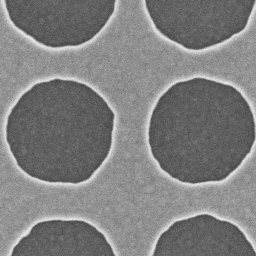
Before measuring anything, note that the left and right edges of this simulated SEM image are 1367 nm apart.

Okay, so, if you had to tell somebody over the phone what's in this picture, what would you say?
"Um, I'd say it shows holes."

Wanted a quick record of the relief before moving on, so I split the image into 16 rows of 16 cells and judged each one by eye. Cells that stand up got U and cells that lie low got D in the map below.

DDDDDDDUUDDDDDDD
UDDDDDDUUUDDDDDU
UUDDDDUUUUUDDDUU
UUUUUUUUUUUUUUUU
UUUUUUUUUUUUUUUU
UUDDDDUUUUUDDDDU
UDDDDDDUUUDDDDDD
DDDDDDDUUDDDDDDD
DDDDDDDUUDDDDDDD
UDDDDDDUUDDDDDDD
UDDDDDUUUUDDDDDU
UUUUUUUUUUUUUUUU
UUUUUUUUUUUUUUUU
UUUUUUUUUUUUDUUU
UUDDDDUUUUDDDDDU
UDDDDDDUUUDDDDDD